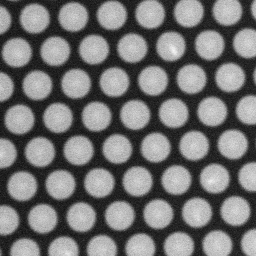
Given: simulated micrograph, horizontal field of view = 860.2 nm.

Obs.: an array of small figures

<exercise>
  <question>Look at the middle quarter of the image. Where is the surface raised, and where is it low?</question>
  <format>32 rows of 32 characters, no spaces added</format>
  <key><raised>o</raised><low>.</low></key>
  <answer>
..............................oo
...o.......oooo.....ooooo....ooo
oooooo....oooooo...oooooo...oooo
oooooo...ooooooo...ooooooo..oooo
oooooo...ooooooo...ooooooo..oooo
oooooo...ooooooo...ooooooo...ooo
oooooo....oooooo...oooooo.....oo
oooooo.....oooo......ooo........
................................
................oooo.....ooooo..
o.....ooooo....oooooo...oooooo..
o....oooooo...ooooooo...ooooooo.
oo...ooooooo..ooooooo...ooooooo.
oo...ooooooo..ooooooo...ooooooo.
oo...oooooo....oooooo....ooooo..
oo...oooooo....ooooo......ooo...
o.....ooo.......................
......................oo......oo
..oooo.....ooooo....ooooo.....oo
.ooooo....oooooo....oooooo...ooo
ooooooo...ooooooo..ooooooo...ooo
ooooooo...ooooooo..ooooooo...ooo
ooooooo...ooooooo...oooooo....oo
ooooooo....ooooo....ooooo......o
.ooooo......ooo.......o.........
................................
.......ooo......ooooo.....ooooo.
oo....oooooo...ooooooo...oooooo.
oo...ooooooo...ooooooo..oooooooo
ooo..ooooooo...ooooooo..oooooooo
ooo..ooooooo...ooooooo...oooooo.
oo....oooooo....ooooo....oooooo.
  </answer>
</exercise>